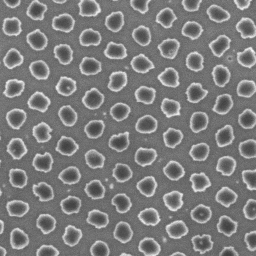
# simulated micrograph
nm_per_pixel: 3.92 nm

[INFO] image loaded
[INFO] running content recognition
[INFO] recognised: a regular array of raised bodies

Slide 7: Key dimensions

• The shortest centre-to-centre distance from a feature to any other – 113 nanometres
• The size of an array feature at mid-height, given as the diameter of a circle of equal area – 74.9 nm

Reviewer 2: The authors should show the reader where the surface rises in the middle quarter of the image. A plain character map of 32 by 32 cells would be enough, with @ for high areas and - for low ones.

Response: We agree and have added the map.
----@@@@@--------@@@@@---------@
----@@@@@---------@@@----@@@----
-----@@@----@@@---------@@@@----
@----------@@@@@--------@@@@@---
@@@--------@@@@@--------@@@@----
@@@--------@@@@-----------@@---@
@@@----@----@@----@@@@@--------@
@@----@@@---------@@@@@--------@
-----@@@@@--------@@@@---------@
-----@@@@@---------@@@---@@@----
@-----@@@---@@@@--------@@@@@---
@@----------@@@@@--------@@@@---
@@@---------@@@@---------@@@@---
@@@---------@@@----@@@----------
@@@---@@@---------@@@@@---------
-@---@@@@@--------@@@@@---------
-----@@@@@--------@@@@@---@@@---
------@@@-----@@---------@@@@@--
@@----------@@@@---------@@@@@--
@@@--------@@@@@---------@@@@---
@@@--------@@@@@----------@@----
@@@----@-----@@---@@@@----------
@@---@@@@---------@@@@@---------
-----@@@@@--------@@@@@---------
------@@@@--------@@@@-----@----
------@@@@---@@@----------@@@---
@@@@--------@@@@@--------@@@@@--
@@@@--------@@@@@--------@@@@@--
@@@@---------@@@@---@@----@@@---
@@@----@@-----@----@@@@---------
-----@@@@@--------@@@@@---------
-----@@@@@---------@@@@---------